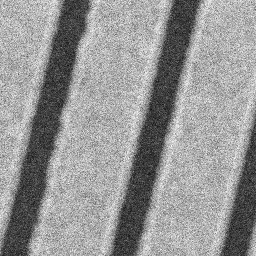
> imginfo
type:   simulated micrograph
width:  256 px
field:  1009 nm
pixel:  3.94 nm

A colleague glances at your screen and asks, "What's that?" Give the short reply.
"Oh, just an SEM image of one or a few lines or trenches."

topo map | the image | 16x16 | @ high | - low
@@@@--@@@@---@@@
@@@---@@@@--@@@@
@@@--@@@@@--@@@@
@@@--@@@@@--@@@@
@@@--@@@@---@@@@
@@---@@@@--@@@@@
@@--@@@@@--@@@@@
@@--@@@@@--@@@@@
@@--@@@@---@@@@-
@---@@@@--@@@@@-
@--@@@@@--@@@@@-
@--@@@@@--@@@@@-
@--@@@@---@@@@--
---@@@@--@@@@@--
--@@@@@--@@@@@--
--@@@@@--@@@@@--